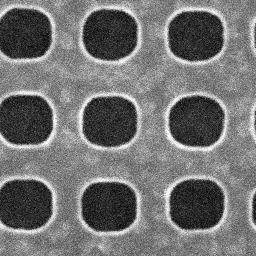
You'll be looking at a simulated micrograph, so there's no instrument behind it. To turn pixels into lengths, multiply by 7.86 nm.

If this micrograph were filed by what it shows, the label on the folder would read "holes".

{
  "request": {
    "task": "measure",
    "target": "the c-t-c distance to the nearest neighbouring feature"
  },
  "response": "669 nm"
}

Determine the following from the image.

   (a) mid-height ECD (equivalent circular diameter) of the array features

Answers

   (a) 445 nm